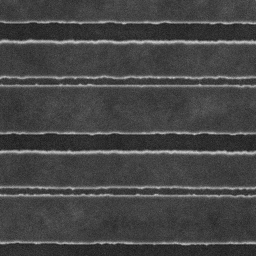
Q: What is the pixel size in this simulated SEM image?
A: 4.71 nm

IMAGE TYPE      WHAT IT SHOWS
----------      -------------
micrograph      lines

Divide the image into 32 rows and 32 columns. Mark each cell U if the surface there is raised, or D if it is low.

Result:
UUUUUUUUUUUUUUUUUUUUUUUUUUUUUUUU
UUUUUUUUUUUUUUUUUUUUUUUUUUUUUUUU
UUUUUUUUUUUUUUUUUUUUUUUUUUUUUUUU
DDDDDDDDDDDDDDDDDDDDDDDDDDDDDDDD
DDDDDDDDDDDDDDDDDDDDDDDDDDDDDDDD
UUUUUUUUUUUUUUUUUUUUUUUUUUUUUUUU
UUUUUUUUUUUUUUUUUUUUUUUUUUUUUUUU
UUUUUUUUUUUUUUUUUUUUUUUUUUUUUUUU
UUUUUUUUUUUUUUUUUUUUUUUUUUUUUUUU
UUUUUUUUUUUUUUUUUUUUUUUUUUUUUUUU
UUUUUUUUUUUUUUUUUUUUUUUUUUUUUUUU
UUUUUUUUUUUUUUUUUUUUUUUUUUUUUUUU
UUUUUUUUUUUUUUUUUUUUUUUUUUUUUUUU
UUUUUUUUUUUUUUUUUUUUUUUUUUUUUUUU
UUUUUUUUUUUUUUUUUUUUUUUUUUUUUUUU
UUUUUUUUUUUUUUUUUUUUUUUUUUUUUUUU
UUUUUUUUUUUUUUUUUUUUUUUUUUUUUUUU
DDDDDDDDDDDDDDDDDDDDDDDDDDDDDDDD
DDDDDDDDDDDDDDDDDDDDDDDDDDDDDDDD
UUUUUUUUUUUUUUUUUUUUUUUUUUUUUUUU
UUUUUUUUUUUUUUUUUUUUUUUUUUUUUUUU
UUUUUUUUUUUUUUUUUUUUUUUUUUUUUUUU
UUUUUUUUUUUUUUUUUUUUUUUUUUUUUUUU
UUUUUUUUUUUUUUUUUUUUUUUUUUUUUUUU
UUUUUUUUUUUUUUUUUUUUUUUUUUUUUUUU
UUUUUUUUUUUUUUUUUUUUUUUUUUUUUUUU
UUUUUUUUUUUUUUUUUUUUUUUUUUUUUUUU
UUUUUUUUUUUUUUUUUUUUUUUUUUUUUUUU
UUUUUUUUUUUUUUUUUUUUUUUUUUUUUUUU
UUUUUUUUUUUUUUUUUUUUUUUUUUUUUUUU
DDDDDDDDDDDDDDDDDDDDDDUUDUDDDDDD
DDDDDDDDDDDDDDDDDDDDDDDDDDDDDDDD